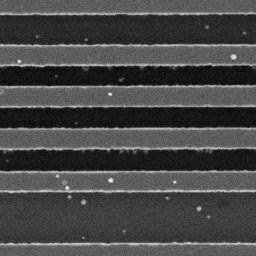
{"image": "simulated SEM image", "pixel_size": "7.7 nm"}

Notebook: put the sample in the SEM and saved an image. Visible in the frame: lines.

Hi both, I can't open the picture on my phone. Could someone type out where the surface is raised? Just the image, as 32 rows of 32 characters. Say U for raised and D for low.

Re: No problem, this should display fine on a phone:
UUUUUUUUUUUUUUUUUUUUUUUUUUUUUUUU
UUUUUUUUUUUUUUUUUUUUUUUUUUUUUUUU
DDDDDDDDDDDDDDDDDDDDDDDDDDDDDDDD
DDDDDDDDDDDDDDDDDDDDDDDDDDDDDDDD
DDDDDDDDDDDDDDDDDDDDDDDDDDDDDDDD
DDDDDDDDDDDDDDDDDDDDDDDDDDDDDDDD
UUUUUUUUUUUUUUUUUUUUUUUUUUUUUUUU
UUUUUUUUUUUUUUUUUUUUUUUUUUUUUUUU
DDDDDDDDDDDDDDDDDDDDDDDDDDDDDDDD
DDDDDDDDDDDDDDDDDDDDDDDDDDDDDDDD
DDDDDDDDDDDDDDDDDDDDDDDDDDDDDDDD
UUUUUUUUUUUUUUUUUUUUUUUUUUUUUUUU
UUUUUUUUUUUUUUUUUUUUUUUUUUUUUUUU
DDDDDDDDDDDDDDDDDDDDDDDDDDDDDDDD
DDDDDDDDDDDDDDDDDDDDDDDDDDDDDDDD
DDDDDDDDDDDDDDDDDDDDDDDDDDDDDDDD
UUUUUUUUUUUUUUUUUUUUUUUUUUUUUUUU
UUUUUUUUUUUUUUUUUUUUUUUUUUUUUUUU
UUUUUUUUUUUUUUUUUUUUUUUUUUUUUUUU
DDDDDDDDDDDDDDDDDDDDDDDDDDDDDDDD
DDDDDDDDDDDDDDDDDDDDDDDDDDDDDDDD
UUUUUUUUUUUUUUUUUUUUUUUUUUUUUUUU
UUUUUUUUUUUUUUUUUUUUUUUUUUUUUUUU
UUUUUUUUUUUUUUUUUUUUUUUUUUUUUUUU
DDDDDDDDDDDDDDDDDDDDDDDDDDDDDDDD
DDDDDDDDDDDDDDDDDDDDDDDDDDDDDDDD
DDDDDDDDDDDDDDDDDDDDDDDDDDDDDDDD
DDDDDDDDDDDDDDDDDDDDDDDDDDDDDDDD
DDDDDDDDDDDDDDDDDDDDDDDDDDDDDDDD
DDDDDDDDDDDDDDDDDDDDDDDDDDDDDDDD
UUUUUUUUUUUUUUUUUUUUUUUUUUUUUUUU
UUUUUUUUUUUUUUUUUUUUUUUUUUUUUUUU